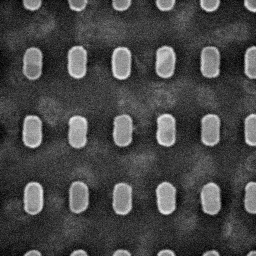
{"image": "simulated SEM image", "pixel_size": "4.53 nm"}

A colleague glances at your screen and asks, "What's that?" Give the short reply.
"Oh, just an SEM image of a regular array of raised bodies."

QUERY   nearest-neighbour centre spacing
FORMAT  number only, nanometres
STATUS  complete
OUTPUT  200